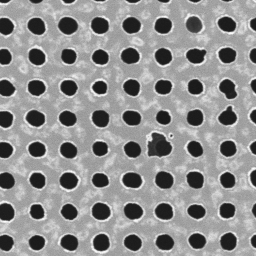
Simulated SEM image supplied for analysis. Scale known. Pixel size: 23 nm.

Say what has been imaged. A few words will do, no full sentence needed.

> a regular array of holes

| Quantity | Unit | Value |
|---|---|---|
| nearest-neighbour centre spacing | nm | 707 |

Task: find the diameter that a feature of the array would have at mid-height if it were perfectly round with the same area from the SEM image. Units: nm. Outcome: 392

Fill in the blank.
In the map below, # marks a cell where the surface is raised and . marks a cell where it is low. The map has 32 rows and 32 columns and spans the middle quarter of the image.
################################
################################
################################
################################
...#####..#####...#####....####.
...####....####....####....####.
...####....####....####....####.
...#####..######...#####..######
################################
################################
################################
################################
..#####....####....####...#####.
...####....####....####....####.
...####....####....####....####.
#.######...#####################
################################
######################..########
######################...#######
.#######..######.####.....######
...####....####....##......####.
...####....####....##......####.
...#####...####....##.....######
#.##############################
################################
################################
################################
...#####..#####...#####....####.
...####....####....####....####.
....###....####....####....####.
...#####...####....####....####.
################################